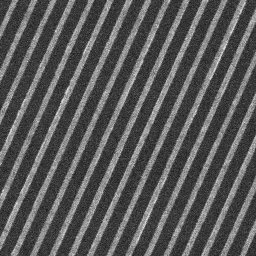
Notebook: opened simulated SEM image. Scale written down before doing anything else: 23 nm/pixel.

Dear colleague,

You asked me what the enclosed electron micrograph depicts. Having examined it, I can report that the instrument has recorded parallel lines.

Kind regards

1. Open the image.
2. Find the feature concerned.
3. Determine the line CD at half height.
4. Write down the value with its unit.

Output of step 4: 108 nanometers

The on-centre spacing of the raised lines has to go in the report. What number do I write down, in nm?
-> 399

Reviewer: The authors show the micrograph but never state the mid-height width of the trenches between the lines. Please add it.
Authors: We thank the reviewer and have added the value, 291 nanometers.